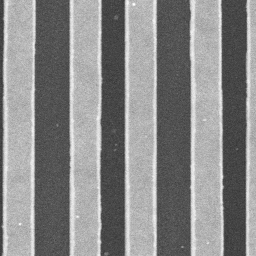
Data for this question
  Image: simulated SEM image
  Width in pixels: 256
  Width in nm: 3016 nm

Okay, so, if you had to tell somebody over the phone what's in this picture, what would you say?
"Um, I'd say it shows lines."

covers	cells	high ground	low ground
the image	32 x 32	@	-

-@@@-----@@@@---@@@-----@@@@---@
-@@@-----@@@@---@@@-----@@@@---@
-@@@-----@@@@---@@@-----@@@@---@
-@@@-----@@@@---@@@-----@@@@---@
-@@@-----@@@@---@@@-----@@@@---@
-@@@-----@@@@---@@@-----@@@@---@
-@@@-----@@@@---@@@-----@@@@---@
-@@@-----@@@@---@@@-----@@@@---@
@@@@-----@@@@---@@@-----@@@@---@
-@@@-----@@@@---@@@-----@@@@---@
-@@@-----@@@@---@@@-----@@@@---@
-@@@-----@@@@---@@@-----@@@@---@
@@@@-----@@@@---@@@-----@@@@---@
-@@@-----@@@@---@@@-----@@@@---@
-@@@-----@@@----@@@-----@@@@---@
-@@@-----@@@----@@@-----@@@@---@
-@@@-----@@@@---@@@-----@@@@---@
-@@@-----@@@@---@@@-----@@@@---@
-@@@-----@@@----@@@-----@@@@---@
-@@@-----@@@----@@@-----@@@@---@
-@@@-----@@@----@@@-----@@@@---@
@@@@-----@@@----@@@-----@@@@---@
@@@@-----@@@----@@@-----@@@@---@
@@@@-----@@@----@@@-----@@@@---@
@@@@-----@@@----@@@-----@@@@---@
@@@@-----@@@@---@@@-----@@@@---@
@@@@-----@@@@---@@@-----@@@@---@
@@@@-----@@@@---@@@-----@@@@---@
@@@@-----@@@@---@@@-----@@@@---@
@@@@-----@@@----@@@-----@@@@---@
@@@@-----@@@----@@@-----@@@@---@
@@@@-----@@@----@@@-----@@@@---@